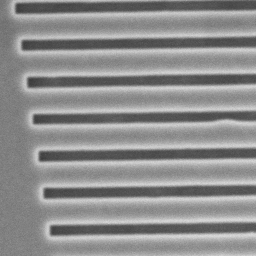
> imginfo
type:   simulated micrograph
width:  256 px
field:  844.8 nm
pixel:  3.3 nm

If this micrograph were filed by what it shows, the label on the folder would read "parallel lines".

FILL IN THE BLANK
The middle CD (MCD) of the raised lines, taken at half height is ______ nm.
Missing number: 85.1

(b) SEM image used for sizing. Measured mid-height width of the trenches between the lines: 0.0363 microns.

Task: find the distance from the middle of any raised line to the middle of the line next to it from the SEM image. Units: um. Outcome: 0.122